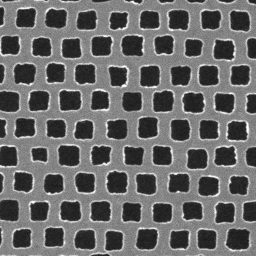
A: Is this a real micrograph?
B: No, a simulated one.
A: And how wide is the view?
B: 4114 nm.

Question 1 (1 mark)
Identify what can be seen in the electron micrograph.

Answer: a regular array of holes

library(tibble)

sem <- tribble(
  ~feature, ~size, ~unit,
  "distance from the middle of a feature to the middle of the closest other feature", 469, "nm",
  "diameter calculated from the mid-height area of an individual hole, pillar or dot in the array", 347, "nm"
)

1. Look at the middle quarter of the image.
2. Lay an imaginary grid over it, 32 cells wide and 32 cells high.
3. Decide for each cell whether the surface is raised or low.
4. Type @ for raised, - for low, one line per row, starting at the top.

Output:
@@@-----@@@@@@@@@@@@---@@@@@---@
@@@-----@@@-----@@@-----@@@-----
@@@-----@@@-----@@@-----@@@-----
@@@-----@@@-----@@@-----@@@-----
@@@-----@@@-----@@@-----@@@----@
@@@@@@@@@@@@---@@@@@---@@@@@@@@@
@@@@@@@@@@@@@@@@@@@@@@@@@-@@@@@@
----@@@----@@@@----@@@-----@@@--
----@@@----@@@@-----@@-----@@@--
----@@@----@@@------@@------@@--
----@@@----@@@------@@-----@@@--
---@@@@--@@@@@@----@@@-----@@@--
@@@@@@@@@@@@@@@@@@@@@@@@@@@@@@@@
@@@@@@@@@@@@@@@@@@@----@@@@@@@@@
@@@----@@@@-----@@@-----@@@----@
-@@-@--@@@@-----@@@----@@@@----@
-@@-----@@@-----@@------@@@-----
-@-----@@@@-----@@-----@@@@----@
@@@----@@@@----@@@@---@@@@@----@
@@@@@@@@@@@@@@@@@@@@@@@@@@@@@@@@
---@@@@-@--@@@@@@@@@@@@--@@@@@@@
----@@@-----@@@-----@@-----@@@@-
----@@@-----@@@-----@@-----@@@@-
----@@@-----@@@-----@@-----@@@@-
----@@@----@@@@-----@@-----@@@@-
---@@@@@@@@@@@@@@@@@@@@@@-@@@@@-
@@@@@@@@@@@@@@@@@@@@@@@@@@@@@@@@
@@@----@@@@-----@@@---@@@@@@@--@
@@@-----@@@-----@@-----@@@-----@
@@@-----@@@-----@@-----@@@-----@
@@@-----@@@-----@@-----@@@-----@
@@@-----@@@-----@@-----@@@-----@